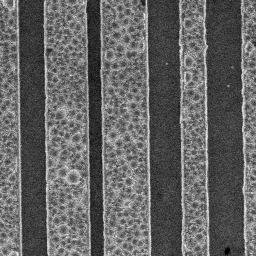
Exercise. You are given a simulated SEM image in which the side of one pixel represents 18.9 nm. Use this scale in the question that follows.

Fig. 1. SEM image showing one or a few lines or trenches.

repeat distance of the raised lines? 1200 nanometers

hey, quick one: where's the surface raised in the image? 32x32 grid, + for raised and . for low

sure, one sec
++....+++++..+++++....++++....++
++....+++++..+++++.....+++....++
++....+++++..+++++.....+++....++
++....+++++..+++++.....+++....++
++....+++++..+++++....++++....++
++....+++++..+++++....++++....++
++....+++++..+++++.....+++....++
++....+++++..+++++.....+++....++
++....+++++..+++++.....+++....++
++....+++++..+++++.....+++....++
++....+++++..++++++....+++....++
++....+++++..++++++....+++....++
++....+++++..++++++....+++....++
++....+++++..+++++.....+++....++
++....+++++..++++++....+++....++
++....+++++..++++++....+++....++
++....+++++..++++++....+++....++
++....+++++..++++++....+++.....+
++....+++++..++++++....+++....++
++....+++++..++++++....+++....++
++....+++++..++++++....+++.....+
+++...+++++..++++++....+++.....+
+++...+++++..++++++....+++....++
+++...+++++..++++++....+++....++
+++...+++++..++++++....+++.....+
+++...+++++..++++++....+++.....+
+++...+++++..++++++....+++.....+
+++...+++++..++++++....+++.....+
+++...+++++..++++++....+++.....+
+++...+++++..++++++....+++.....+
+++...+++++..++++++....+++.....+
+++...+++++..++++++....+++.....+